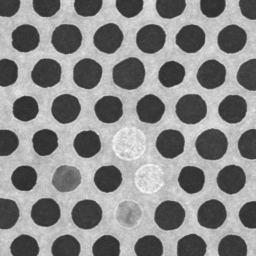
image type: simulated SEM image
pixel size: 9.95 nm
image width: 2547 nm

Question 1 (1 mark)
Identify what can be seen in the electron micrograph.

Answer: a regular array of holes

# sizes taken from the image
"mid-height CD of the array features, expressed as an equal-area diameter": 294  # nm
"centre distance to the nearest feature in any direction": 399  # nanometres